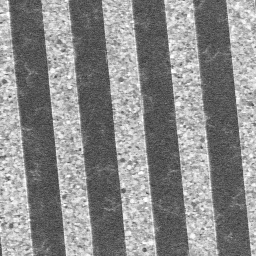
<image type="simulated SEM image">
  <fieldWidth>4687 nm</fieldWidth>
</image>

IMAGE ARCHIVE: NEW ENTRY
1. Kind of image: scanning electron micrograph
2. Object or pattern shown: one or a few lines or trenches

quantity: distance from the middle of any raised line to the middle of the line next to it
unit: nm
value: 1130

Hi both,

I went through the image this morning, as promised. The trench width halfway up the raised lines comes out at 620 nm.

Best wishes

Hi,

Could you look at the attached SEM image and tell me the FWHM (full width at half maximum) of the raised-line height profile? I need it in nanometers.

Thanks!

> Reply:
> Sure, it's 501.